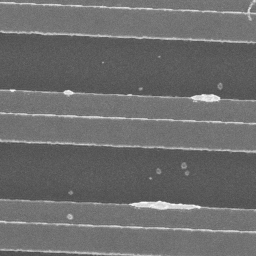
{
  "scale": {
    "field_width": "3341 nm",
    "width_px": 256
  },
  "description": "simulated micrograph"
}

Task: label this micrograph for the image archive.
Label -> lines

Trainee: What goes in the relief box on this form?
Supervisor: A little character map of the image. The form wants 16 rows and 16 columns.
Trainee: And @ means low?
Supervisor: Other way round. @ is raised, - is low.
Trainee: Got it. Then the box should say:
@@@@@@@@@@@@@@@@
@@@@@@@@@@@@@@@@
------------@@@@
----------------
----------------
----------------
@@@@@@@@@@@@@@@@
@@@@@@@@@@@@@@@@
@@@@@@@@@@@@@@@@
----------------
----------------
----------------
----------------
@@@@@@@@@@@@@@@@
@@@@@@@@@@@@@@@@
@@@@@@@@@@@@@@@@